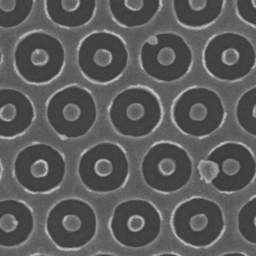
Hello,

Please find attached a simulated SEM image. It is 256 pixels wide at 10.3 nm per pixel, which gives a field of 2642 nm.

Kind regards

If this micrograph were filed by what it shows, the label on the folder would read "a regular array of ring-shaped grooves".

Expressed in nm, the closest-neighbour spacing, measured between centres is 649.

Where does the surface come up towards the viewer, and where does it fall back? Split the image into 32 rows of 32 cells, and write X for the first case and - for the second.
XX--XX--XX--XX--XX--XX--XX--XX--
----XX------XX------XX------XX--
---XXXX----XXXX----XXX-----XXXX-
XXXXXXXXXXXXXXXXXXXXXXXXXXXXXXXX
XXXX--XXXXX---XXXXXX--XXXXX---XX
XX------XX-----XXX-----XXX-----X
XX--XX--XX--XX--XX--XX--XX--XX--
XX--XX--XX--XX--XX--XX--XX--XX--
XX------XX------XX------XX-----X
XXX----XXXX----XXXX----XXXX----X
XXXXXXXXXXXXXXXXXXXXXXXXXXXXXXXX
--XXXXX----XXXX----XXXX----XXXX-
----XX------XX------XX------XX--
XX--XX--XX--XX--XX--XX--XX--XX--
XX--XX--XX--XX--XX--XX--XX--XX--
----XX------XX------XX------XX--
---XXXX----XXXX----XXXX---XXXXX-
XXXXXXXXXXXXXXXXXXXXXXXXXXXXXXXX
XXX----XXXX----XXXX----XXXX----X
XX------XX------XX------XX------
XX--XX--XX--XX--XX--XX--XXX-XX--
XX--XX--XX--XX--XX--XX--XXX-XX--
XX------XX------XX------XXX----X
XXX----XXXX----XXXX---XXXXX---XX
XXXXXXXXXXXXXXXXXXXXXXXXXXXXXXXX
---XXXX----XXXX----XXXX----XXXX-
----XX------XX------XX------XX--
XX--XX--XX--XX--XX--XX--XX--XX--
XX--XX--XX--XX--XX--XX--X---XX--
----XX------XX------XX-----XXX--
---XXXX----XXXX----XXXXX--XXXXXX
XXXXXXXXXXXXXXXXXXXXXXXXXXXXXXXX